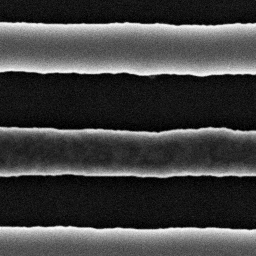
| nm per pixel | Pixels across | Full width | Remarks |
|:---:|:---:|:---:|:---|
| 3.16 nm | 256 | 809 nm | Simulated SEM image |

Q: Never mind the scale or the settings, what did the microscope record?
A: lines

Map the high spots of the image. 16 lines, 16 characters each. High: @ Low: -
----------------
@@@---@@@@----@@
@@@@@@@@@@@@@@@@
@@@@@@@@@@@@@@@@
--@@@@@@@@@@@@@@
----------------
----------------
----------------
@@@@@@@@@@@@@@@@
@@@@@@@@@@@@@@@@
@@@@@@@@@@@@@@@@
----------------
----------------
----------------
@@@@@@@@@@@@@@@@
@@@@@@@@@@@@@@@@